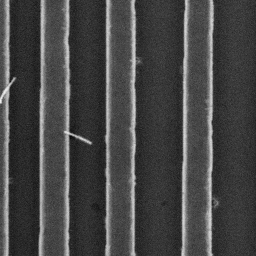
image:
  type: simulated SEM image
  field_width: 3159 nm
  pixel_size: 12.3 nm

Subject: lines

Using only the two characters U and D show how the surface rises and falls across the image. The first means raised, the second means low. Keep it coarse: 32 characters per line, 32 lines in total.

UDDDDUUUUDDDDUUUUDDDDDDUUUDDDDDD
UDDDDUUUUDDDDUUUUDDDDDDUUUDDDDDD
UDDDDUUUUDDDDUUUUDDDDDDUUUDDDDDD
UDDDDUUUUDDDDUUUUDDDDDDUUUDDDDDD
UDDDDUUUDDDDDUUUUDDDDDDUUUDDDDDD
UDDDDUUUDDDDDUUUUDDDDDDUUUDDDDDD
UDDDDUUUDDDDDUUUUDDDDDDUUUDDDDDD
UDDDDUUUUDDDDUUUUDDDDDDUUUDDDDDD
UDDDDUUUUDDDDUUUUDDDDDDUUUDDDDDD
UDDDDUUUUDDDDUUUUDDDDDDUUUDDDDDD
UDDDDUUUUDDDDUUUUDDDDDDUUUDDDDDD
UDDDDUUUUDDDDUUUUDDDDDDUUUDDDDDD
UDDDDUUUUDDDDUUUUDDDDDDUUUDDDDDD
UDDDDUUUUDDDDUUUUDDDDDDUUUDDDDDD
UDDDDUUUUDDDDUUUUDDDDDDUUUDDDDDD
UDDDDUUUUDDDDUUUUDDDDDDUUUDDDDDD
UDDDDUUUUDDDDUUUUDDDDDDUUUDDDDDD
UDDDDUUUUDDDDUUUUDDDDDDUUUDDDDDD
UDDDDUUUUDDDDUUUUDDDDDDUUUDDDDDD
UDDDDUUUUDDDDUUUUDDDDDDUUUDDDDDD
UDDDDUUUUDDDDUUUUDDDDDDUUUDDDDDD
UDDDDUUUUDDDDUUUUDDDDDDUUUDDDDDD
UDDDDUUUUDDDDUUUUDDDDDDUUUDDDDDD
UDDDDUUUUDDDDUUUUDDDDDDUUUDDDDDD
UDDDDUUUDDDDDUUUUDDDDDDUUUDDDDDD
UDDDDUUUUDDDDUUUUDDDDDDUUUDDDDDD
UDDDDUUUUDDDDUUUUDDDDDDUUUDDDDDD
UDDDDUUUDDDDDUUUUDDDDDDUUUDDDDDD
UDDDDUUUDDDDDUUUUDDDDDDUUUDDDDDD
UDDDDUUUDDDDDUUUUDDDDDDUUUDDDDDD
UDDDDUUUDDDDDUUUUDDDDDDUUUDDDDDD
UDDDDUUUDDDDDUUUUDDDDDDUUUDDDDDD